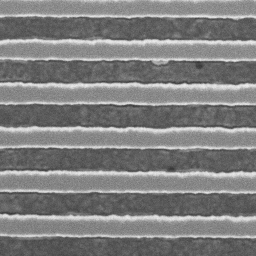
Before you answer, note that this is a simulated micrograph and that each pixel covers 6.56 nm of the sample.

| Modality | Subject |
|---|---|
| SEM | lines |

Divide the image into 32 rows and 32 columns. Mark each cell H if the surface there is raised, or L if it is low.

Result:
HHHHHHHHHHHHHHHHHHHHHHHHHHHHHHHH
HHHHHHHHHHHHHHHHHHHHHHHHHHHHHHHH
LLLLLLLLLLLLLLLLLLLLLLLLLLLLLLLL
LLLLLLLLLLLLLLLLLLLLLLLLLLLLLLLL
LLLLLLLLLLLLLLLLLLLLLLLLLLLLLLLL
HHHHHHHHHHHHHHHHHHHHHHHHHHHHHHHH
HHHHHHHHHHHHHHHHHHHHHHHHHHHHHHHH
LLLHHHLHHLHHHHLHLHHHHHHHHHHHHHHH
LLLLLLLLLLLLLLLLLLLLLLLLLLLLLLLL
LLLLLLLLLLLLLLLLLLLLLLLLLLLLLLLL
HHHHLLHLLHHLHHHHHLLLLLLLLLLLLLLL
HHHHHHHHHHHHHHHHHHHHHHHHHHHHHHHH
HHHHHHHHHHHHHHHHHHHHHHHHHHHHHHHH
LLLLLLLLLLLLLLLLLLLLLLLLLLLLLLLL
LLLLLLLLLLLLLLLLLLLLLLLLLLLLLLLL
LLLLLLLLLLLLLLLLLLLLLLLLLLLLLLLL
HHHHHHHHHHHHHHHHHHHHHHHHHHHHHHHH
HHHHHHHHHHHHHHHHHHHHHHHHHHHHHHHH
LLLLLLLLLLLLLLLLLHLLHHHHLLHHHHHH
LLLLLLLLLLLLLLLLLLLLLLLLLLLLLLLL
LLLLLLLLLLLLLLLLLLLLLLLLLLLLLLLL
HHHHHHHHHHHHHHHHLHHHHLLLHHLLLHHL
HHHHHHHHHHHHHHHHHHHHHHHHHHHHHHHH
HHHHHHHHHHHHHHHHHHHHHHHHHHHHHHHH
LLLLLLLLLLLLLLLLLLLLLLLLLLLLLLLL
LLLLLLLLLLLLLLLLLLLLLLLLLLLLLLLL
LLLLLLLLLLLLLLLLLLLLLLLLLLLLLLLL
HHHHHHHHHHHHHHHHHHHHHHHHHHHHHHHH
HHHHHHHHHHHHHHHHHHHHHHHHHHHHHHHH
LHHHHHHHHHHHHHHHHHHHHHHHHHHHHHHH
LLLLLLLLLLLLLLLLLLLLLLLLLLLLLLLL
LLLLLLLLLLLLLLLLLLLLLLLLLLLLLLLL